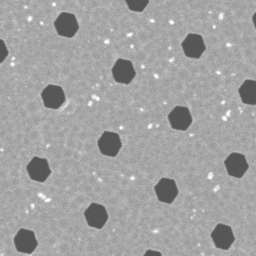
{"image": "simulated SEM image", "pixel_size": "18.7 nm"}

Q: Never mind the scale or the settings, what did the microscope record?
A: a regular array of holes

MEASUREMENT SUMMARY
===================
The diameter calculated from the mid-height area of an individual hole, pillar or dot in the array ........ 461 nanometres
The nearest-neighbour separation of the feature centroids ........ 1360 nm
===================